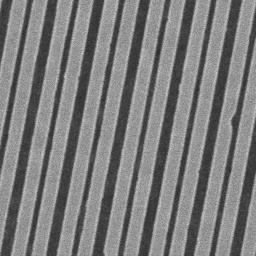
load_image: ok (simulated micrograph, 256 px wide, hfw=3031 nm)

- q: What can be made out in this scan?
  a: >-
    parallel lines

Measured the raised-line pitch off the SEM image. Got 22.6 px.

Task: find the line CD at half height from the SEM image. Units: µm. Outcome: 0.154